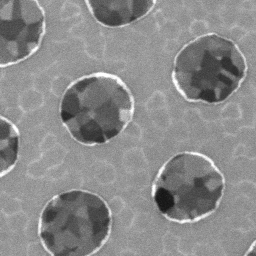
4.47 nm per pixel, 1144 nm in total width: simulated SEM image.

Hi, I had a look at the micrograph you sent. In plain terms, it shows raised bodies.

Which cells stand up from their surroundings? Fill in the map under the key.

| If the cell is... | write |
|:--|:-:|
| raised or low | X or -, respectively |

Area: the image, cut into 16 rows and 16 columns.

XXX---XXX-------
XXX---XX--------
XXX---------XX--
XX---------XXXX-
-----------XXXX-
----XXXX---XXXX-
----XXXX--------
----XXXX--------
X----XX---------
X---------------
X---------XXXX--
----------XXXX--
---XXX----XXXX--
---XXXX---XXX---
--XXXXX---------
---XXX----------